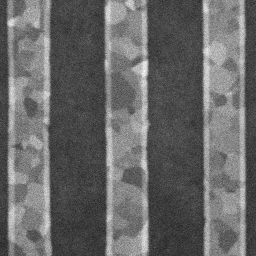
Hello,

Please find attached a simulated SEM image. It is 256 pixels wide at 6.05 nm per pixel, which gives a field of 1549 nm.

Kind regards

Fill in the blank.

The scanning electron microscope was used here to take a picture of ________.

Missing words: one or a few lines or trenches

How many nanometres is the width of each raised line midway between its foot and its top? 215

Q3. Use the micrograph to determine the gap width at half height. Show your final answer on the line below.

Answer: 0.377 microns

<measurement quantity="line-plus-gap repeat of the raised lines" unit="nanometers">591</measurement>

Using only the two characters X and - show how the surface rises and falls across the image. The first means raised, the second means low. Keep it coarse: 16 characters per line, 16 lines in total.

-XX----XX----XX-
-XX----XX----XX-
-XX----XX----XX-
-XX----XX----XX-
-XX----XX----XX-
-XX----XX----XX-
-XX----XX----XX-
-XX----XX----XX-
-XX----XX----XX-
-XX----XX----XX-
-XX----XX----XX-
-XX----XX----XX-
-XX----XX----XX-
-XX----XX----XX-
-XX----XX----XX-
-XX----XX----XX-